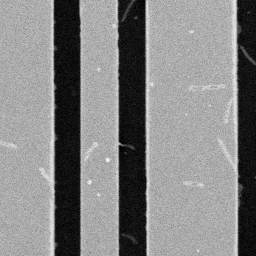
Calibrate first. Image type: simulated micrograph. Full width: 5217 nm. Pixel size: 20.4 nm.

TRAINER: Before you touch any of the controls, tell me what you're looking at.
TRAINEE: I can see lines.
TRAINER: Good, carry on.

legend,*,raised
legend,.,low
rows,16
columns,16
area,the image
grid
***..**..******.
***..**..******.
***..**..******.
***..**..******.
***..**..******.
***..**..******.
***..**..******.
***..**..******.
***..**..******.
***..**..******.
***..**..******.
***..**..******.
***..**..******.
***..**..******.
***..**..******.
***..**..******.